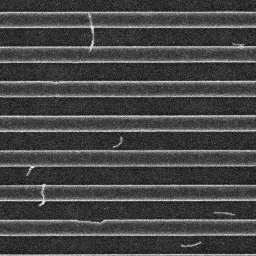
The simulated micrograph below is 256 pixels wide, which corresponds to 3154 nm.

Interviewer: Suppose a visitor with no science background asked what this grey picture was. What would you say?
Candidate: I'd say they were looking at parallel lines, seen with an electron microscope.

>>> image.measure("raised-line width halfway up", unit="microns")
0.194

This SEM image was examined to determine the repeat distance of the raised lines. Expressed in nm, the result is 427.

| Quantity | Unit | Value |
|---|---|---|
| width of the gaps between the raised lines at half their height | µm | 0.228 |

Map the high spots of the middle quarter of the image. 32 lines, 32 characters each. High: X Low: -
--------------------------------
--------------------------------
--------------------------------
--------------------------------
XXXXXXXXXXXXXXXXXXXXXXXXXXXXXXXX
XXXXXXXXXXXXXXXXXXXXXXXXXXXXXXXX
XXXXXXXXXXXXXXXXXXXXXXXXXXXXXXXX
XXXXXXXXXXXXXXXXXXXXXXXXXXXXXXXX
--------------------------------
--------------------------------
--------------------------------
--------------------------------
--------------------------------
XXXXXXXXXXXXXXXXXXXXXXXXXXXXXXXX
XXXXXXXXXXXXXXXXXXXXXXXXXXXXXXXX
XXXXXXXXXXXXXXXXXXXXXXXXXXXXXXXX
XXXXXXXXXXXXXXXXXXXXXXXXXXXXXXXX
--------------------------------
--------------------------------
--------------------------------
--------------------------------
--------------------------------
XXXXXXXXXXXXXXXXXXXXXXXXXXXXXXXX
XXXXXXXXXXXXXXXXXXXXXXXXXXXXXXXX
XXXXXXXXXXXXXXXXXXXXXXXXXXXXXXXX
--------------------------------
--------------------------------
--------------------------------
--------------------------------
--------------------------------
XXXXXXXXXXXXXXXXXXXXXXXXXXXXXXXX
XXXXXXXXXXXXXXXXXXXXXXXXXXXXXXXX